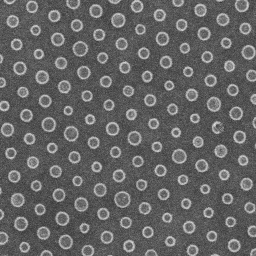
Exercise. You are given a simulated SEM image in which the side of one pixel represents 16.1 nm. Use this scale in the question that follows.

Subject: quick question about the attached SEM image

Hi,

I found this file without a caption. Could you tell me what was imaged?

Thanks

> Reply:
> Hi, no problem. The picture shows a regular array of raised bodies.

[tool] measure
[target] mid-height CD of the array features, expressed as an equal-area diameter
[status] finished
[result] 168 nanometres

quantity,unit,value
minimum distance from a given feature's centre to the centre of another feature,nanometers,380